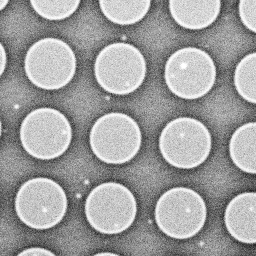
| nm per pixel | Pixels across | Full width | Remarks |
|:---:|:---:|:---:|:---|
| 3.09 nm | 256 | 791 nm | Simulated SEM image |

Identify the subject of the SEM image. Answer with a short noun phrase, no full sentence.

an array of small figures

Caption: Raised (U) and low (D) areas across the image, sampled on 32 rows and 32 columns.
UDDDUUUUUUDDDUUUUUUDDUUUUUUDDDUU
DDDDDUUUUDDDDUUUUUDDDUUUUUUDDDUU
DDDDDDDDDDDDDDUUUDDDDDUUUUUDDDUU
DDDDDDDDDDDDDDDDDDDDDDDDUDDDDDDU
DDDDDDDDDDDDDDDDDDDDDDDDDDDDDDDD
DDDDUUUUDDDDDDDDDDDDDDDDDDDDDDDD
UDDDUUUUUDDDDUUUUDDDDDUUUDDDDDDD
UDDUUUUUUDDDUUUUUUDDDUUUUUDDDDUU
DDDUUUUUUDDDUUUUUUDDDUUUUUUDDDUU
DDDDUUUUUDDDUUUUUUDDDUUUUUUDDUUU
DDDDDUUUDDDDDUUUUDDDDUUUUUUDDDUU
DDDDDDDDDDDDDDUUDDDDDDUUUUDDDDUU
DDDDDDDDDDDDDDDDDDDDDDDDDDDDDDDU
DDDDDDDDDDDDDDDDDDDDDDDDDDDDDDDD
DDDDUUUUDDDDDUUUDDDDDDDDDDDDDDDD
DDDUUUUUUDDDUUUUUDDDDUUUUDDDDDDU
DDDUUUUUUDDUUUUUUDDDUUUUUUDDDUUU
DDDUUUUUUDDUUUUUUUDDUUUUUUDDDUUU
DDDUUUUUDDDDUUUUUDDDUUUUUUDDDUUU
DDDDUUUDDDDDUUUUUDDDDUUUUUDDDUUU
DDDDDDDDDDDDDDDDDDDDDDUUUDDDDDUU
DDDDDDDDDDDDDDDDDDDDDDDDDDDDDDDU
DDDDUUDDDDDDDDDDDDDDDDDDDDDDDDDD
DDDUUUUUDDDDUUUUDDDDDDDDDDDDDDDD
DDUUUUUUDDDUUUUUUDDDUUUUUDDDDDUU
DDUUUUUUDDDUUUUUUDDDUUUUUDDDDUUU
DDUUUUUUDDDUUUUUUDDUUUUUUUDDUUUU
DDDUUUUDDDDUUUUUUDDDUUUUUUDDUUUU
DDDDUUDDDDDDUUUUDDDDUUUUUDDDUUUU
DDDDDDDDDDDDDDDDDDDDDUUUDDDDDUUU
DDDDDDDDDDDDDDDDDDDDDDDDDDDDDDDD
DDDUUUDDDDDDDDDDDDDDDDDDDDDDDDDD